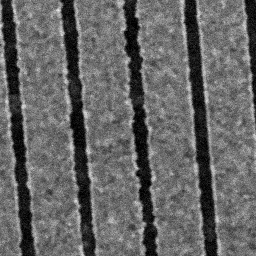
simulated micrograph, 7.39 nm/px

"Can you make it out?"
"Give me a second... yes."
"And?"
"one or a few lines or trenches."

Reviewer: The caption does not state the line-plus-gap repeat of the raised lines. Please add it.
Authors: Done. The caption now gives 451 nm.